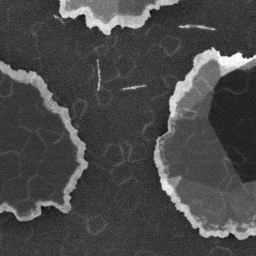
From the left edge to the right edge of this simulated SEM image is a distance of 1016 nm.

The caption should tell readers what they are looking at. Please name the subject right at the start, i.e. raised bodies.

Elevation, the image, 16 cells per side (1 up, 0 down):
0000111111000000
0000001000000000
0000000000000000
0000000000000000
1000000000001111
1110000000011111
1110000000011111
1111000000011111
1111100000111111
1111100000111111
1111100000111111
1111000000111111
1111000000011111
0100000000001111
0000000000000111
0000000000000000